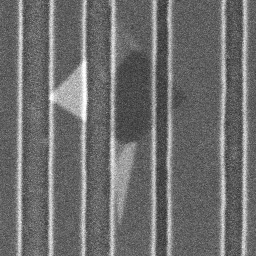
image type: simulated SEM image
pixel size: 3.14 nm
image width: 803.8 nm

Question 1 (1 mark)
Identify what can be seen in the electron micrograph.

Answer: one or a few lines or trenches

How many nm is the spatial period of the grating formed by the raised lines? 202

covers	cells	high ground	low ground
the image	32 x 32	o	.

ooo...ooooo...ooooo..ooooooo...o
ooo...ooooo...ooooo..ooooooo...o
ooo...ooooo...ooooo..ooooooo...o
ooo...ooooo...ooooo..ooooooo...o
ooo...ooooo...ooooo..ooooooo...o
ooo...ooooo...ooooo..ooooooo...o
ooo...ooooo...ooooo..ooooooo...o
ooo...ooooo...ooooo..ooooooo..oo
oo....ooooo...ooooo..ooooooo..oo
ooo...ooooo...ooooo..ooooooo...o
ooo...ooooo...ooooo..ooooooo...o
ooo...ooooo...ooooo..ooooooo...o
ooo...ooooo...ooooo..ooooooo...o
ooo...ooooo...ooooo..ooooooo...o
ooo...ooooo...ooooo..ooooooo...o
ooo...ooooo...ooooo..ooooooo...o
ooo...ooooo...ooooo..ooooooo...o
ooo...ooooo...ooooo..ooooooo...o
ooo...ooooo...ooooo..ooooooo...o
ooo...oooo....ooooo..ooooooo...o
oo....oooo....ooooo..ooooooo...o
oo....ooooo...ooooo..ooooooo...o
oo....ooooo...ooooo..ooooooo...o
oo....ooooo...ooooo..ooooooo...o
oo....oooo....ooooo..ooooooo...o
oo....oooo....ooooo..ooooooo...o
ooo...oooo....ooooo..ooooooo..oo
ooo...oooo....ooooo..ooooooo...o
ooo...oooo....ooooo..ooooooo..oo
ooo...oooo....ooooo..ooooooo..oo
oo....oooo....ooooo..ooooooo..oo
oo....oooo....ooooo..ooooooo..oo